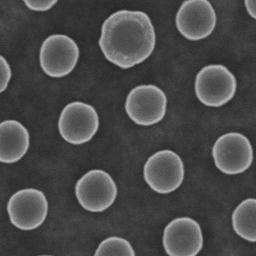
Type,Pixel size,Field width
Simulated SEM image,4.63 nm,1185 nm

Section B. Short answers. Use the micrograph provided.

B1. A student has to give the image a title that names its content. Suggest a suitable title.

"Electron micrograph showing a regular array of raised bodies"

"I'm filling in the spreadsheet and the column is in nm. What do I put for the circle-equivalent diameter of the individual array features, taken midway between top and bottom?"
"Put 186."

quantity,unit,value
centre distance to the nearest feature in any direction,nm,325